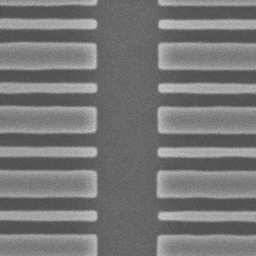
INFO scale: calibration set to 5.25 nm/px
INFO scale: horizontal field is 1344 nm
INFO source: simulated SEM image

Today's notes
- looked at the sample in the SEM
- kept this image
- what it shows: groups of lines, slits or small figures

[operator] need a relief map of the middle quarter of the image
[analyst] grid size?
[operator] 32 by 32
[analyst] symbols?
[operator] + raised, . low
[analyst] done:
++++++++................++++++++
................................
................................
................................
................................
++++++++................++++++++
++++++++................++++++++
................................
................................
................................
................................
++++++++................++++++++
++++++++................++++++++
++++++++................++++++++
++++++++................++++++++
++++++++................++++++++
++++++++................++++++++
................................
................................
................................
................................
++++++++................++++++++
++++++++................++++++++
................................
................................
................................
................................
++++++++...............+++++++++
++++++++...............+++++++++
++++++++...............+++++++++
++++++++...............+++++++++
++++++++...............+++++++++